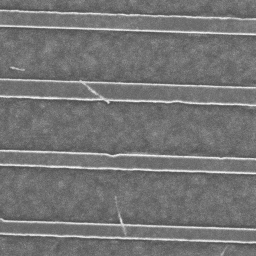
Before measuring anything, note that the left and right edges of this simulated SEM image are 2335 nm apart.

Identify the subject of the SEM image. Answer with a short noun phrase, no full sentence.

one or a few lines or trenches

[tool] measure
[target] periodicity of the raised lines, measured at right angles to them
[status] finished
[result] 636 nm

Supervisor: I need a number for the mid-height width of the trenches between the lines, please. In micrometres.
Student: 0.489